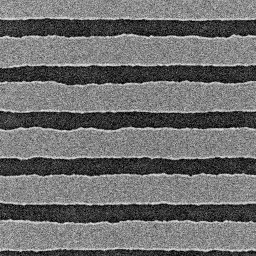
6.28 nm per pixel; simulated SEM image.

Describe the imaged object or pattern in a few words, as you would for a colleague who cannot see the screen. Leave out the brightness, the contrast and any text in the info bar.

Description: lines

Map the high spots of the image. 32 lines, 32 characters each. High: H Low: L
HHHHHHHHHHHHHHHHHHHHHHHHHHHHHHHH
HHHHHHHHHHHHHHHHHHHHHHHHHHHHHHHH
LLLLLLLLLLLLLLLLLLLLLLHHHHLHHHLL
LLLLLLLLLLLLLLLLLLLLLLLLLLLLLLLL
LLLLLLHLLLLLLLLHHLLLLLLLLLLLLHLH
HHHHHHHHHHHHHHHHHHHHHHHHHHHHHHHH
HHHHHHHHHHHHHHHHHHHHHHHHHHHHHHHH
HHHHHHHHHHHHHHHHHHHHHHHHHHHHHHHH
LLLLLLLLLLLLLLLLLLLLLLLLLLLLLLLL
LLLLLLLLLLLLLLLLLLLLLLLLLLLLLLLL
HHHHHHHHLLLHLHLLHHHHHHHHHHHHHHHH
HHHHHHHHHHHHHHHHHHHHHHHHHHHHHHHH
HHHHHHHHHHHHHHHHHHHHHHHHHHHHHHHH
HHHHHHHHHHHHHHHHHHHHHHHHHHHHHHHH
LLLLLLLLLLLLLLLLLLLLLLLLLLLLLLLL
LLLLLLLLLLLLLLLLLLLLLLLLLLLLLLLL
HHHHHHHHHHHHHHHHHHHHHHHHHHHHHHHH
HHHHHHHHHHHHHHHHHHHHHHHHHHHHHHHH
HHHHHHHHHHHHHHHHHHHHHHHHHHHHHHHH
HHHHHHHHHHHHHHHHHHHHHHHHHHHHHHHH
LLLLLLLLLLLLLLLLLLLLLLLLLLLLLLLL
LLLLLLLLLLLLLLLLLLLLLLLLLLLLLLLL
HHHHHHHHHHHHHHHHHHHHHHHHHHHHHHHH
HHHHHHHHHHHHHHHHHHHHHHHHHHHHHHHH
HHHHHHHHHHHHHHHHHHHHHHHHHHHHHHHH
LLHHLLLLHLLHHLLLLLLLLHLLHLLLLLLL
LLLLLLLLLLLLLLLLLLLLLLLLLLLLLLLL
LHLLLLLLLLLLLLLLLLLLLLLLLLLLLLLL
HHHHHHHHHHHHHHHHHHHHHHHHHHHHHHHH
HHHHHHHHHHHHHHHHHHHHHHHHHHHHHHHH
HHHHHHHHHHHHHHHHHHHHHHHHHHHHHHHH
LLLLLLLLLLLLLLLLLLLLLLLLLLLLLLLL